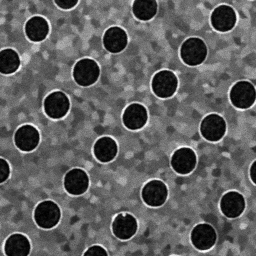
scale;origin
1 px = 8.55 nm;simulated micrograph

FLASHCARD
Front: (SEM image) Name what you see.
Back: a regular array of holes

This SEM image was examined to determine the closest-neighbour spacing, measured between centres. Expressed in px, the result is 43.8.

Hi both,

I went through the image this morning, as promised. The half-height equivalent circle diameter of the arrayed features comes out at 232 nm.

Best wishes